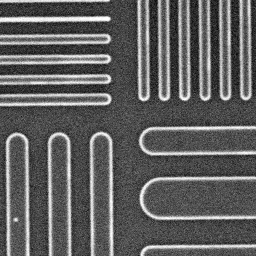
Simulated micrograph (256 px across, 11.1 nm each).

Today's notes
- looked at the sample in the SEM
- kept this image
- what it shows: groups of lines, slits or small figures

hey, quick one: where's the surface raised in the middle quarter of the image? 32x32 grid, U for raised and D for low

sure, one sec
DDDDDDDDDDDDDDDDDDDUUDDDUUDDDUUD
DDDDDDDDDDDDDDDDDDDUUDDDUUDDDUUD
DDDDDDDDDDDDDDDDDDDUUDDDUUDDDUUD
UUUUUUUUUUUUDDDDDDDUUDDDUUDDDUUD
UUUUUUUUUUUDDDDDDDDUUDDDUUDDDUUD
DDDDDDDDDDDDDDDDDDDUUDDDUUDDDUUD
DDDDDDDDDDDDDDDDDDDUUDDDUUDDDUUD
DDDDDDDDDDDDDDDDDDDUUDDDUUDDDUUD
UUUUUUUUUUUUDDDDDDDUUDDDUUDDDUUD
UUUUUUUUUUUDDDDDDDDDDDDDDDDDDDDD
DDDDDDDDDDDDDDDDDDDDDDDDDDDDDDDD
DDDDDDDDDDDDDDDDDDDDDDDDDDDDDDDD
DDDDDDDDDDDDDDDDDDDDDDDDDDDDDDDD
DDDDDDDDDDDDDDDDDDDDDDDDDDDDDDDD
DDDDDDDDDDDDDDDDDDDDDDDDDDDDDDDD
DDDDDDDDDDDDDDDDDDDDDDDDDDDDDDDD
DDDDDDDDDDDDDDDDDDDDDUUUUUUUUUUU
DDDDDDDDUUDDDDDDDDDDUUUUUUUUUUUU
UDDDDDDUUUUUDDDDDDDUUUUUUUUUUUUU
UDDDDDDUUUUUDDDDDDDUUUUUUUUUUUUU
UDDDDDDUUUUUDDDDDDDUUUUUUUUUUUUU
UDDDDDDUUUUUDDDDDDDDUUUUUUUUUUUU
UDDDDDDUUUUUDDDDDDDDDUUUUUUUUUUU
UDDDDDDUUUUUDDDDDDDDDDDDDDDDDDDD
UDDDDDDUUUUUDDDDDDDDDDDDDDDDDDDD
UDDDDDDUUUUUDDDDDDDDDDDDDDDDDDDD
UDDDDDDUUUUUDDDDDDDDDDDDDDDDDDDD
UDDDDDDUUUUUDDDDDDDDDDDDDDDDDDDD
UDDDDDDUUUUUDDDDDDDDDDDDDDDDDDDD
UDDDDDDUUUUUDDDDDDDDDUUUUUUUUUUU
UDDDDDDUUUUUDDDDDDDDUUUUUUUUUUUU
UDDDDDDUUUUUDDDDDDDDUUUUUUUUUUUU